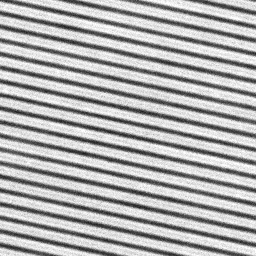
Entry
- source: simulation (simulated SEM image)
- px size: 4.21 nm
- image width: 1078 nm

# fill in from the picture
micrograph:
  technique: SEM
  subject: parallel lines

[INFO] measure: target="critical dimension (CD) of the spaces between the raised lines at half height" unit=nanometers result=26.8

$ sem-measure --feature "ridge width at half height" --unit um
0.0309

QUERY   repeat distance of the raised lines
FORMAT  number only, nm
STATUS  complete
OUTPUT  56.2